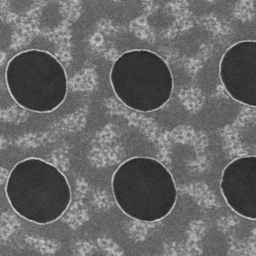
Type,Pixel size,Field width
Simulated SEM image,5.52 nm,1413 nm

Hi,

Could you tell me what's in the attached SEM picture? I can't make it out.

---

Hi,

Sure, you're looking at holes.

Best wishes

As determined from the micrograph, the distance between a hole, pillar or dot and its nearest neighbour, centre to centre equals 583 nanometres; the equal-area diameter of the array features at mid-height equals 344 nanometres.